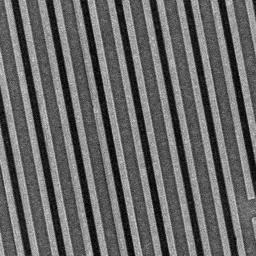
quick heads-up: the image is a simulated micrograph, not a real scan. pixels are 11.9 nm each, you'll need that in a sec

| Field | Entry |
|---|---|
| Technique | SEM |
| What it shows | parallel lines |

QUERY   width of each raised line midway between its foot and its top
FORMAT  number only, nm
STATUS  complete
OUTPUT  71.6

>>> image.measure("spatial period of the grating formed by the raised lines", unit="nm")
200